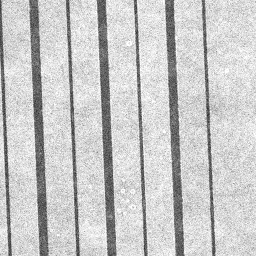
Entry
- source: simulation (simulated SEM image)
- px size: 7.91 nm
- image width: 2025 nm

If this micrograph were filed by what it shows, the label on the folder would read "parallel lines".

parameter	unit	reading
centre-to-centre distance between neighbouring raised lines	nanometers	273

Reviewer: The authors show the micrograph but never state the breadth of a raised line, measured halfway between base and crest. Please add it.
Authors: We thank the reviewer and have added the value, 214 nm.